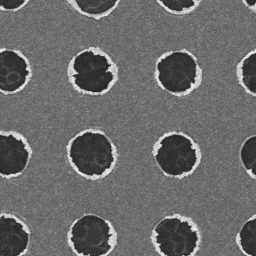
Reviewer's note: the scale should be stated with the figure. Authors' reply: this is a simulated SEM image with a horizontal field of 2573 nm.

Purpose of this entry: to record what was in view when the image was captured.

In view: holes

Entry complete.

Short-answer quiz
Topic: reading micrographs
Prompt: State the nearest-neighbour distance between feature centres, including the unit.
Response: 0.827 µm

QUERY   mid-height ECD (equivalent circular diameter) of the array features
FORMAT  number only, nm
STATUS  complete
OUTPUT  400